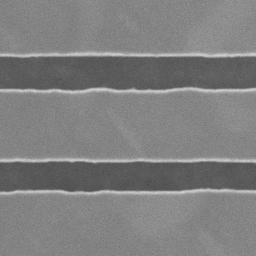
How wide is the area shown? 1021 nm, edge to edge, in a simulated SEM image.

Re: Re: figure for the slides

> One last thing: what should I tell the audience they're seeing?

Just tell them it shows lines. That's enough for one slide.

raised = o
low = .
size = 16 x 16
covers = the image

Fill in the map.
oooooooooooooooo
oooooooooooooooo
oooooooooooooooo
.o...........o..
................
...........o....
oooooooooooooooo
oooooooooooooooo
oooooooooooooooo
oooooooooooooooo
................
................
oooooooooooooooo
oooooooooooooooo
oooooooooooooooo
oooooooooooooooo